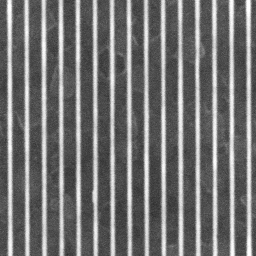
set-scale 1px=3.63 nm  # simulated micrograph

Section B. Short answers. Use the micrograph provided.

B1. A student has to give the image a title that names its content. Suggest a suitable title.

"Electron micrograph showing parallel lines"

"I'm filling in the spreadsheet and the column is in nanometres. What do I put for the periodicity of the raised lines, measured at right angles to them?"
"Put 61.9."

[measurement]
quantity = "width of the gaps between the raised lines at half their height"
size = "14.5 px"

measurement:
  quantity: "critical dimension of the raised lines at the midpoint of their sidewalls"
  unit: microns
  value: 0.0091